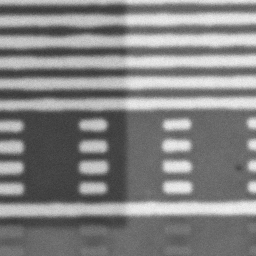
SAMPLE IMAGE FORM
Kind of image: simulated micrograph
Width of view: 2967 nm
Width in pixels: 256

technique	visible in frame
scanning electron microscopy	wiring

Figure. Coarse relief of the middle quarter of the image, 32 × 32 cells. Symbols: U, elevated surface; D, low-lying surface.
UUUUUUUUUUUUUUUUUUUUUUUUUUUUDDDD
DDDDDDDDDDDDDDDDDDDDDDDDDDDDDDDD
DDDDDDDDDDDDDDDDDDDDDDDDDDDDDDDD
DDDDDDDDDUUUUUUUUUUUUUUUUUUUUUUU
UUUUUUUUUUUUUUUUUUUUUUUUUUUUUUUU
UUUUUUUUUUUUUUUUUUUUUUUUUUUUUUUU
DDDDDDDDDDDDDDDDDDDDDDDDDDDDDDDD
DDDDDDDDDDDDDDDDDDDDDDDDDDDDDDDD
DDDDDDDDDDDDDDDDDDDDDDDDDDDDDDDD
UUUUUUUUUUUUUUUUUUUUUUUUUUUUUUUU
UUUUUUUUUUUUUUUUUUUUUUUUUUUUUUUU
DDDDDDDDDDDDDDDDDDDDDDDDDDDDDDDD
DDDDDDDDDDDDDDDDDDDDDDDDDDDDDDDD
DDDDDDDDDDDDDDDDDDDDDDDDDDDDDDDD
DDDDUUUUUUDDDDDDDDDDDDDDDUUUUUUD
DDDDUUUUUUUDDDDDDDDDDDDDDUUUUUUD
DDDDDDDUUUDDDDDDDDDDDDDDDDDDDDDD
DDDDDDDDDDDDDDDDDDDDDDDDDDDDDDDD
DDDDDDDDDDDDDDDDDDDDDDDDDDDDDDDD
DDDDDUUUUUDDDDDDDDDDDDDDDUUUUUUD
DDDDUUUUUUUDDDDDDDDDDDDDDUUUUUUD
DDDDUUUUUUDDDDDDDDDDDDDDDUUUDDDD
DDDDDDDDDDDDDDDDDDDDDDDDDDDDDDDD
DDDDDDDDDDDDDDDDDDDDDDDDDDDDDDDD
DDDDDUUUUUDDDDDDDDDDDDDDDUUUUUUD
DDDDUUUUUUUDDDDDDDDDDDDDDUUUUUUU
DDDDUUUUUUUDDDDDDDDDDDDDDUUUUUUD
DDDDDDDDDDDDDDDDDDDDDDDDDDDDDDDD
DDDDDDDDDDDDDDDDDDDDDDDDDDDDDDDD
DDDDDDDDDDDDDDDDDDDDDDDDDDDDDDDD
DDDDUUUUUUDDDDDDDDDDDDDDDUUUUUUU
DDDDUUUUUUDDDDDDDDDDDDDDDUUUUUUU